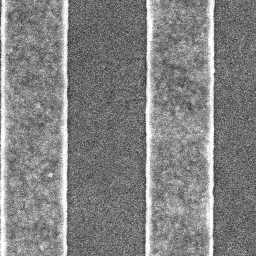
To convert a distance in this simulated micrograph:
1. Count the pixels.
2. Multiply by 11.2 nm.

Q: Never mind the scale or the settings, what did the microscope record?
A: one or a few lines or trenches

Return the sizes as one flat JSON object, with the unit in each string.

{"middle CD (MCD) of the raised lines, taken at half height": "0.717 um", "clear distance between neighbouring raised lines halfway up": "922 nm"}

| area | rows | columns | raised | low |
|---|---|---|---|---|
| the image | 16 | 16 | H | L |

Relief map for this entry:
HHHHLLLLLHHHHLLL
HHHHLLLLLHHHHLLL
HHHHLLLLLHHHHLLL
HHHHLLLLLHHHHLLL
HHHHLLLLLHHHHLLL
HHHHLLLLLHHHHLLL
HHHHLLLLLHHHHLLL
HHHHLLLLLHHHHLLL
HHHHLLLLLHHHHLLL
HHHHLLLLLHHHHLLL
HHHHLLLLLHHHHLLL
HHHHLLLLLHHHHLLL
HHHHLLLLLHHHHLLL
HHHHLLLLLHHHHLLL
HHHHLLLLLHHHHLLL
HHHHLLLLLHHHHLLL